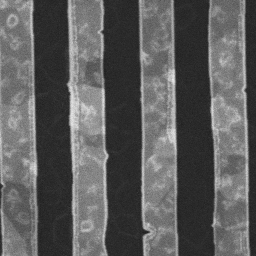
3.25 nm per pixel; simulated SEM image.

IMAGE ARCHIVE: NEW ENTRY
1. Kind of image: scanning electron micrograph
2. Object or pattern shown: one or a few lines or trenches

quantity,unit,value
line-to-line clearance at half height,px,38.2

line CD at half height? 106 nm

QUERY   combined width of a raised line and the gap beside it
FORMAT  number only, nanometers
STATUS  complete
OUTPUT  230